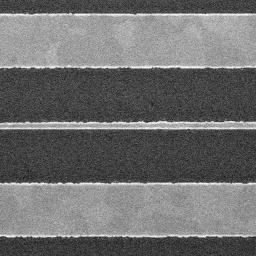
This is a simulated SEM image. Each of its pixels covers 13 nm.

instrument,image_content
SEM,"lines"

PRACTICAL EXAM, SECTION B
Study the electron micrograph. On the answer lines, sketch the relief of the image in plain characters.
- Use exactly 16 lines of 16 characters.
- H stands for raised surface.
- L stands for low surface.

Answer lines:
LLLLLLLLLLLLLLLL
HHHHHHHHHHHHHHHH
HHHHHHHHHHHHHHHH
HHHHHHHHHHHHHHHH
LLLLLLLLLLLLLLLL
LLLLLLLLLLLLLLLL
LLLLLLLLLLLLLLLL
LLLLLLLLLLLLLLLL
LLLLLLLLLLLLLLLL
LLLLLLLLLLLLLLLL
LLLLLLLLLLLLLLLL
LLHLLHLHHHHHHHHH
HHHHHHHHHHHHHHHH
HHHHHHHHHHHHHHHH
HHHHHHHHHHHHHHHH
LLLLLLLLLLLLLLLL